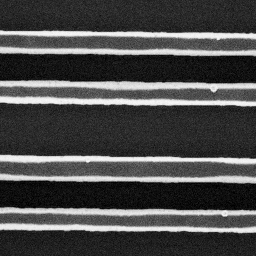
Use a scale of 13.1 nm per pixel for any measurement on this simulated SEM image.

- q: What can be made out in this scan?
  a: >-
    lines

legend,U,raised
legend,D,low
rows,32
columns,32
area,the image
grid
DDDDDDDDDDDDDDDDDDDDDDDDDDDDDDDD
DDDDDDDDDDDDDDDDDDDDDDDDDDDDDDDD
DDDDDDDDDDDDDDDDDDDDDDDDDDDDDDDD
DDDDDDDDDDDDDDDDDDDDDDDDDDDDDDDD
UUUUUUUUUUUUUUUUUUUUUUUUUUUUUUUU
UUUUUUUUUUUUUUUUUUUUUUUUUUUUUUUU
DDDDDDDDDDDUUUUUUUUUUUUUUUUUUUUU
DDDDDDDDDDDDDDDDDDDDDDDDDDDDDDDD
DDDDDDDDDDDDDDDDDDDDDDDDDDDDDDDD
DDDDDDDDDDDDDDDDDDDDDDDDDDDDDDDD
UUUUUUUUUUDDDDDDDDDDDDDDDDDDDDDD
UUUUUUUUUUUUUUUUUUUUUUUUUUUUUUUU
UUUUUUUUUUUUUUUUUUUUUUUUUUUUUUUU
DDDDDDDDDDDDDDDDDDDDDDDDDDDDDDDD
DDDDDDDDDDDDDDDDDDDDDDDDDDDDDDDD
DDDDDDDDDDDDDDDDDDDDDDDDDDDDDDDD
DDDDDDDDDDDDDDDDDDDDDDDDDDDDDDDD
DDDDDDDDDDDDDDDDDDDDDDDDDDDDDDDD
DDDDDDDDDDDDDDDDDDDDDDDDDDDDDDDD
DDDDDDDDDDDDDDDDDDDDDDDDDDDDDDDD
UUUUUUUUUUUUUUUUUUUUUUUUUUUUUUUU
UUUUUUUUUUUUUUUUUUUUUUUUUUUUUUUU
DDDDDDDDDDDDDDDDDDDDDDDUUUDDDDUU
DDDDDDDDDDDDDDDDDDDDDDDDDDDDDDDD
DDDDDDDDDDDDDDDDDDDDDDDDDDDDDDDD
DDDDDDDDDDDDDDDDDDDDDDDDDDDDDDDD
UUUUUUUUUUUUUUUUUUUUUUUUUUDUUDDD
UUUUUUUUUUUUUUUUUUUUUUUUUUUUUUUU
DDDDDDDUUDUUUUUUUUUUUUUUUUUUUUUU
DDDDDDDDDDDDDDDDDDDDDDDDDDDDDDDD
DDDDDDDDDDDDDDDDDDDDDDDDDDDDDDDD
DDDDDDDDDDDDDDDDDDDDDDDDDDDDDDDD